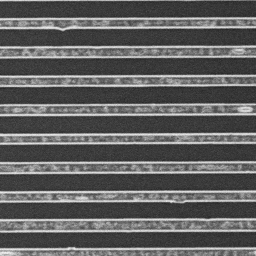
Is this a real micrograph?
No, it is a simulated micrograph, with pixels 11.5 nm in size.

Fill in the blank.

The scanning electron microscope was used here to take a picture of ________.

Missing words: parallel lines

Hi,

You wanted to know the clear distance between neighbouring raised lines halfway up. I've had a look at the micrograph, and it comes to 216 nanometres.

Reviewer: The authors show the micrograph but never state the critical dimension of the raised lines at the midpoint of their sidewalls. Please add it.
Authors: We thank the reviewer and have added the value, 119 nm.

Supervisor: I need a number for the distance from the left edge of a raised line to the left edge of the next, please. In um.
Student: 0.331